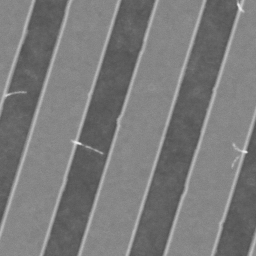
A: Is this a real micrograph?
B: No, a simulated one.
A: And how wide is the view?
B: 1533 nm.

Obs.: one or a few lines or trenches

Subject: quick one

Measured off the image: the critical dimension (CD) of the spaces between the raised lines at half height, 221 nm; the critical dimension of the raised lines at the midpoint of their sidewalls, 268 nm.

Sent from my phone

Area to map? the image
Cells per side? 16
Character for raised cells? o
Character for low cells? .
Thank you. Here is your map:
oo..ooo...ooo..o
oo..ooo..ooo...o
o...ooo..ooo..oo
o..ooo...ooo..oo
o..ooo..ooo...oo
...ooo..ooo...oo
..ooo...ooo..ooo
..ooo...oo...ooo
..ooo..ooo...ooo
..ooo..ooo..ooo.
.ooo...ooo..ooo.
.ooo..ooo...ooo.
.ooo..ooo..ooo..
ooo...ooo..ooo..
ooo..ooo...ooo..
ooo..ooo..ooo...